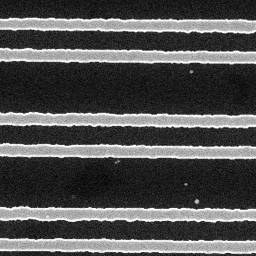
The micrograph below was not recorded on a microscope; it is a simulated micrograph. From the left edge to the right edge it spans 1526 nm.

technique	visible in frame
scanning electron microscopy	lines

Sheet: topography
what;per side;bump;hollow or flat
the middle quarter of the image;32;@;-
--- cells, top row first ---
--------------------------------
--------------------------------
--------------------------------
--------------------------------
--------------------------------
--------------------------------
--------------------------------
--------------------------------
--------------------------------
--------------------------------
--------------------------------
--------------------------------
@@@@@@@-@@@@-------@------------
@@@@@@@@@@@@@@@@@@@@@@@@@@@@@@@@
@@@@@@@@@@@@@@@@@@@@@@@@@@@@@@@@
------------------@----@@@@@@-@@
--------------------------------
--------------------------------
--------------------------------
--------------------------------
@@@@@@@@@@@@@@@@@@@@@-----------
@@@@@@@@@@@@@@@@@@@@@@@@@@@@@@@@
@@@@@@@@@@@@@@@@@@@@@@@@@@@@@@@@
--------------------------------
--------------------------------
--------------------------------
--------------------------------
--------------------------------
--------------------------------
--------------------------------
--------------------------------
--------------------------------